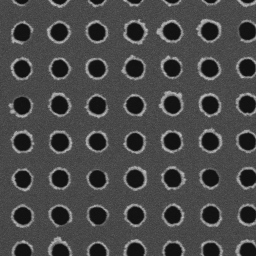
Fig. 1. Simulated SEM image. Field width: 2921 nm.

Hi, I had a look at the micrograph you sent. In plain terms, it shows a regular array of holes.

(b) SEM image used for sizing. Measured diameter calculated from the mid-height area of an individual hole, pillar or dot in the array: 0.2 µm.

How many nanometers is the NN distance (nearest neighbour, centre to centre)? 417